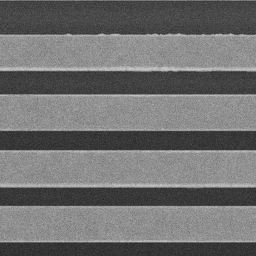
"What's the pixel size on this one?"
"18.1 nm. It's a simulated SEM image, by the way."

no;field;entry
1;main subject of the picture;lines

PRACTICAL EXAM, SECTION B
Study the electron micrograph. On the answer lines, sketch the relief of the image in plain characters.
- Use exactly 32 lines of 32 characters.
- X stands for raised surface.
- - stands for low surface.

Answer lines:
--------------------------------
--------------------------------
--------------------------------
--------------------------------
XXXXXXXXXXXXXXXXXXXXXXXXXXXXXXXX
XXXXXXXXXXXXXXXXXXXXXXXXXXXXXXXX
XXXXXXXXXXXXXXXXXXXXXXXXXXXXXXXX
XXXXXXXXXXXXXXXXXXXXXXXXXXXXXXXX
XXXXXXXXXXXXXXXXXXXXXXXXXXXXXXXX
--------------------------------
--------------------------------
--------------------------------
XXXXXXXXXXXXXXXXXXXXXXXXXXXXXXXX
XXXXXXXXXXXXXXXXXXXXXXXXXXXXXXXX
XXXXXXXXXXXXXXXXXXXXXXXXXXXXXXXX
XXXXXXXXXXXXXXXXXXXXXXXXXXXXXXXX
--------------------------------
--------------------------------
--------------------------------
XXXXXXXXXXXXXXXXXXXXXXXXXXXXXXXX
XXXXXXXXXXXXXXXXXXXXXXXXXXXXXXXX
XXXXXXXXXXXXXXXXXXXXXXXXXXXXXXXX
XXXXXXXXXXXXXXXXXXXXXXXXXXXXXXXX
--------------------------------
--------------------------------
--------------------------------
XXXXXXXXXXXXXXXXXXXXXXXXXXXXXXXX
XXXXXXXXXXXXXXXXXXXXXXXXXXXXXXXX
XXXXXXXXXXXXXXXXXXXXXXXXXXXXXXXX
XXXXXXXXXXXXXXXXXXXXXXXXXXXXXXXX
--------------------------------
--------------------------------